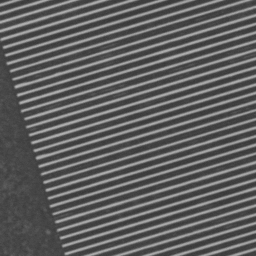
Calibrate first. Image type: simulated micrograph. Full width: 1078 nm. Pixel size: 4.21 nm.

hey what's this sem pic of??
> parallel lines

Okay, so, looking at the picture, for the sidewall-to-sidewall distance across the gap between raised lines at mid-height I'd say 23.2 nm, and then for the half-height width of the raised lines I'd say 11.1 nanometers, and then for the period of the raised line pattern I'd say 34.9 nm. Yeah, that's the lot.